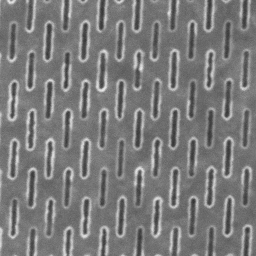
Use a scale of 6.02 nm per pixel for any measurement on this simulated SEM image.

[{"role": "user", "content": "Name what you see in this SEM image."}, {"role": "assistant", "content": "a regular array of holes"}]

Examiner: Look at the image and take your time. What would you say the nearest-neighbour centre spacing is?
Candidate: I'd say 201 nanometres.